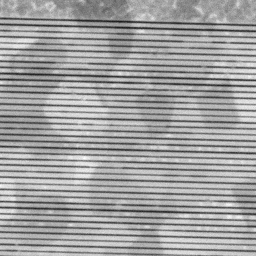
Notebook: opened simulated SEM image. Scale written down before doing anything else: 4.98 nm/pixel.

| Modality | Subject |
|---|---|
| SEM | parallel lines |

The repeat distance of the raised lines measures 30.4 nm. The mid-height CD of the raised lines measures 0.0193 µm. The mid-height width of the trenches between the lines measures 9.3 nm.